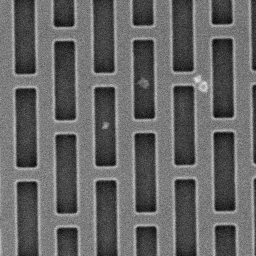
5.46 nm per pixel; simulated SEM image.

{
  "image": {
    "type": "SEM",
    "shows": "groups of lines, slits or small figures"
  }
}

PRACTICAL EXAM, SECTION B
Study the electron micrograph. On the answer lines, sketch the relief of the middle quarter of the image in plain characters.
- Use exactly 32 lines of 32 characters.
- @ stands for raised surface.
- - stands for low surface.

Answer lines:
---@@@@------@@@@------@@@@-----
---@@@@------@@@@------@@@@-----
---@@@@@@@@@@@@@@------@@@@@@@@@
---@@@@@@@@@@@@@@------@@@@@@@@@
---@@@@@@@@@@@@@@------@@@@@@@@@
---@@@@@@@@@@@@@@------@@@@@----
---@@@@------@@@@------@@@@-----
---@@@@------@@@@------@@@@-----
---@@@@------@@@@------@@@@-----
---@@@@------@@@@------@@@@-----
---@@@@------@@@@------@@@@-----
---@@@@------@@@@------@@@@-----
---@@@@------@@@@------@@@@-----
---@@@@------@@@@@-----@@@@-----
@@@@@@@------@@@@@@@@@@@@@@-----
@@@@@@@@-----@@@@@@@@@@@@@@-----
@@@@@@@@-----@@@@@@@@@@@@@@-----
---@@@@@-----@@@@@-----@@@@-----
---@@@@@-----@@@@------@@@@-----
---@@@@@-----@@@@------@@@@-----
---@@@@@-----@@@@------@@@@-----
---@@@@@-----@@@@------@@@@-----
---@@@@@-----@@@@------@@@@-----
---@@@@@-----@@@@------@@@@-----
---@@@@@-----@@@@------@@@@-----
---@@@@@-----@@@@@-----@@@@@@@@@
---@@@@@@@@@@@@@@@-----@@@@@@@@@
---@@@@@@@@@@@@@@@-----@@@@@@@@@
---@@@@@@@@@@@@@@@-----@@@@@@@@@
---@@@@@-----@@@@@-----@@@@@----
---@@@@@-----@@@@@-----@@@@-----
---@@@@@-----@@@@@-----@@@@-----